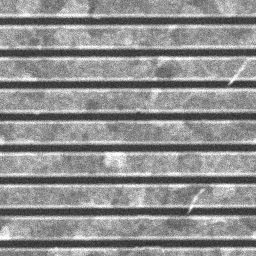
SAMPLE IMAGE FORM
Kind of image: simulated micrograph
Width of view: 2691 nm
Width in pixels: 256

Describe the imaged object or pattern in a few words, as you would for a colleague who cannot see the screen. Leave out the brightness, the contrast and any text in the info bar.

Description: parallel lines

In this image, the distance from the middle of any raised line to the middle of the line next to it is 31.8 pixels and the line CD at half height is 22.7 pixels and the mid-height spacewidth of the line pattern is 99.8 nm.